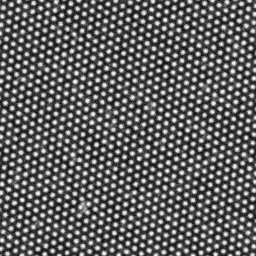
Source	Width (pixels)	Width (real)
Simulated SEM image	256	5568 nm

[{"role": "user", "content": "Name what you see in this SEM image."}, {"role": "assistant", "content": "a regular array of raised bodies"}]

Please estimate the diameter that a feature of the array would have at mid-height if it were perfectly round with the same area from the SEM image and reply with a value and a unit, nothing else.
81.4 nm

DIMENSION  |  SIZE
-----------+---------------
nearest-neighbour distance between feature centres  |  178 nm